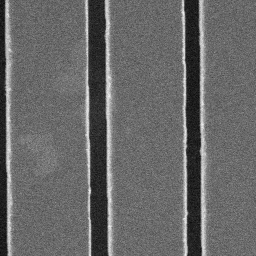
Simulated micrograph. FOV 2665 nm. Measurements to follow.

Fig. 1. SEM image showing lines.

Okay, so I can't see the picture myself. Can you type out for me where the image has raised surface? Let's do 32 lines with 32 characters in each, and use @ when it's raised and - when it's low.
-@@@@@@@@@@--@@@@@@@@@@--@@@@@@@
-@@@@@@@@@@--@@@@@@@@@@--@@@@@@@
-@@@@@@@@@@--@@@@@@@@@@--@@@@@@@
-@@@@@@@@@@--@@@@@@@@@@--@@@@@@@
-@@@@@@@@@@--@@@@@@@@@@--@@@@@@@
-@@@@@@@@@@--@@@@@@@@@@--@@@@@@@
-@@@@@@@@@@--@@@@@@@@@@--@@@@@@@
-@@@@@@@@@@--@@@@@@@@@@--@@@@@@@
-@@@@@@@@@@--@@@@@@@@@@--@@@@@@@
-@@@@@@@@@@--@@@@@@@@@@--@@@@@@@
-@@@@@@@@@@--@@@@@@@@@@--@@@@@@@
-@@@@@@@@@@--@@@@@@@@@@--@@@@@@@
-@@@@@@@@@@--@@@@@@@@@@--@@@@@@@
-@@@@@@@@@@--@@@@@@@@@@--@@@@@@@
-@@@@@@@@@@--@@@@@@@@@@--@@@@@@@
-@@@@@@@@@@--@@@@@@@@@@--@@@@@@@
-@@@@@@@@@@--@@@@@@@@@@--@@@@@@@
-@@@@@@@@@@--@@@@@@@@@@--@@@@@@@
-@@@@@@@@@@--@@@@@@@@@@--@@@@@@@
-@@@@@@@@@@--@@@@@@@@@@--@@@@@@@
-@@@@@@@@@@--@@@@@@@@@@--@@@@@@@
-@@@@@@@@@@--@@@@@@@@@@--@@@@@@@
-@@@@@@@@@@--@@@@@@@@@@--@@@@@@@
-@@@@@@@@@@---@@@@@@@@@--@@@@@@@
-@@@@@@@@@@---@@@@@@@@@--@@@@@@@
-@@@@@@@@@@---@@@@@@@@@--@@@@@@@
-@@@@@@@@@@---@@@@@@@@@--@@@@@@@
-@@@@@@@@@@---@@@@@@@@@--@@@@@@@
-@@@@@@@@@@---@@@@@@@@@--@@@@@@@
-@@@@@@@@@@---@@@@@@@@@--@@@@@@@
-@@@@@@@@@@---@@@@@@@@@--@@@@@@@
-@@@@@@@@@@---@@@@@@@@@--@@@@@@@